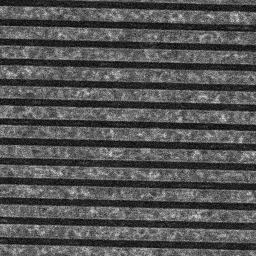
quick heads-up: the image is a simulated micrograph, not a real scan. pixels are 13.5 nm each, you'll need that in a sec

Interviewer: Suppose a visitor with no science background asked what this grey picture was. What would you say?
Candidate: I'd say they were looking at parallel lines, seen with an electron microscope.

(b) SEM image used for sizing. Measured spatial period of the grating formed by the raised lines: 0.267 um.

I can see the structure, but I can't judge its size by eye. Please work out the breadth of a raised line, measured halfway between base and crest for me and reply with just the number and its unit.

160 nm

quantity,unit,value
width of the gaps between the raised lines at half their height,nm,106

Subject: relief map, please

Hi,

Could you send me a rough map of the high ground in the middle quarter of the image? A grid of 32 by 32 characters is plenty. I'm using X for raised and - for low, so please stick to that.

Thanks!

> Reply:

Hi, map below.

--------------------------------
XXXXXXXXXXXXXXXXXXXX------------
XXXXXXXXXXXXXXXXXXXXXXXXXXXXXXXX
XXXXXXXXXXXXXXXXXXXXXXXXXXXXXXXX
-------------------------------X
--------------------------------
XXXXXXXXXXXXXXXXXXXXXXX---------
XXXXXXXXXXXXXXXXXXXXXXXXXXXXXXXX
XXXXXXXXXXXXXXXXXXXXXXXXXXXXXXXX
--------------------------------
--------------------------------
XXXXXXXXXXXXXXXXXXXXXXXXXX------
XXXXXXXXXXXXXXXXXXXXXXXXXXXXXXXX
XXXXXXXXXXXXXXXXXXXXXXXXXXXXXXXX
---------------------------XXXXX
--------------------------------
XXXXXXXXXXXXXXXXXXXXXXXXXXXXX---
XXXXXXXXXXXXXXXXXXXXXXXXXXXXXXXX
XXXXXXXXXXXXXXXXXXXXXXXXXXXXXXXX
--------------------------------
--------------------------------
XXXXXXXXXXXXXXXXXXXXXXXXXXXXXXXX
XXXXXXXXXXXXXXXXXXXXXXXXXXXXXXXX
---XXXXXXXXXXXXXXXXXXXXXXXXXXXXX
--------------------------------
--------------------------------
XXXXXXXXXXXXXXXXXXXXXXXXX--X----
XXXXXXXXXXXXXXXXXXXXXXXXXXXXXXXX
------XXXXXXXXXXXXXXXXXXXXXXXXXX
--------------------------------
--------------------------------
XXXXXXXXXXXXXXXXXXXXXXXXXXXXXXXX